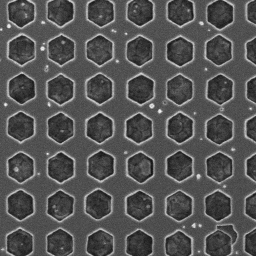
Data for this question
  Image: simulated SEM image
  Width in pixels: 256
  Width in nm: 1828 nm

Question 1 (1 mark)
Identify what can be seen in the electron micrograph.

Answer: a regular array of holes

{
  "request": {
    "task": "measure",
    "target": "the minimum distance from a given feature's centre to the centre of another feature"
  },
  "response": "273 nm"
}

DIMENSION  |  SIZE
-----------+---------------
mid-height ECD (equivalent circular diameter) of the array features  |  198 nm